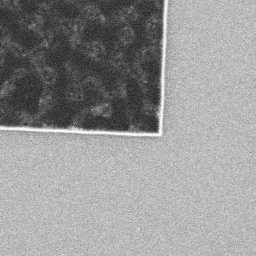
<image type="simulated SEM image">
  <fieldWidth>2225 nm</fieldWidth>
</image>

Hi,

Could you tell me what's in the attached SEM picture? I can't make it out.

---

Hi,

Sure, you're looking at one or a few lines or trenches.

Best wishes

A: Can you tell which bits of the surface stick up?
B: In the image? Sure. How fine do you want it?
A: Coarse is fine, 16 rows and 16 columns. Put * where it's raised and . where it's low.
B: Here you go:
**********......
**********......
**********......
**********......
**********......
**********......
**********......
**********......
................
................
................
................
................
................
................
................